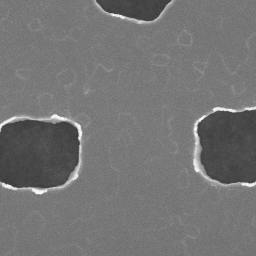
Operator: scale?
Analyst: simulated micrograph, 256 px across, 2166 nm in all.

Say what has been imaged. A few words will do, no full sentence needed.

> holes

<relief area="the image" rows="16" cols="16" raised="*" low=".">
******....******
****************
****************
****************
****************
****************
****************
*.***********...
.....*******....
.....*******....
.....********...
....************
****************
****************
****************
****************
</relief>